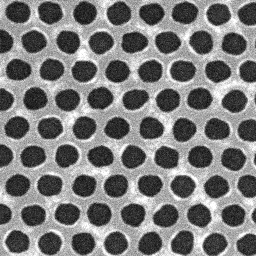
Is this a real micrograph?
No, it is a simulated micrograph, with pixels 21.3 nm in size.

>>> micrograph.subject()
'a regular array of holes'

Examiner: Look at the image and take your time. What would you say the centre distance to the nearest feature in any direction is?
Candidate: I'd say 32.2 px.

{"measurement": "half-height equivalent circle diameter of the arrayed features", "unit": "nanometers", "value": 533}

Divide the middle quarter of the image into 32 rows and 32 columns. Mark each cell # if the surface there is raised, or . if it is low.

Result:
##......###.....###......##.....
##......##.......#.......#......
##......##.......#.......#......
##......##......###.....###.....
###...######...#####...######..#
#########.######################
...####.....#####...####....####
....##......###......##......##.
....##.......#.......##......##.
....##......##.......##......##.
...###.....####.....###......##.
...######.######...#####....####
################################
###....#####...#####...#####..##
###.....###.....###.....###.....
##......##......###......##.....
##......##......###......##.....
##......##......###......##.....
###....####....#####....###.....
############################...#
...#####..######..######..######
....##......###.....###.....###.
....##......##......###......##.
....##.......#......##.......##.
....##......##......###......##.
..#####....####....####.....####
################################
#####.######...#################
###.....##......###.....###.....
##......##......##.......##.....
##......##......##.......#......
##......##......##......###.....